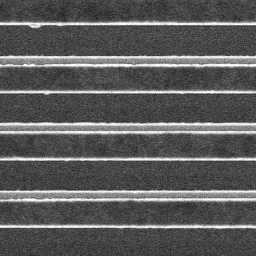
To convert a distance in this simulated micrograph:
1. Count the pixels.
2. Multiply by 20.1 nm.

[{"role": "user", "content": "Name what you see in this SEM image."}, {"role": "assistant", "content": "lines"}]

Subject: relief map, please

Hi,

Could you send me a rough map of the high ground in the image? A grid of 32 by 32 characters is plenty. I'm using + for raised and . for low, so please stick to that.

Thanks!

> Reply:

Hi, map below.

++++++++++++++++++++++++++++++++
++++++++++++++++++++++++++++++++
++++++++++++++++++++++++++++++++
................................
................................
................................
................................
++++++++++++++++++++++++++++++++
++++++++++++++++++++++++++++++++
++++++++++++++++++++++++++++++++
++++++++++++++++++++++++++++++++
+.+..++++.+++.+.++++++++++++++++
................................
................................
................................
................................
++++++++++++++++++++++++++++++++
++++++++++++++++++++++++++++++++
++++++++++++++++++++++++++++++++
++++++++++++++++++++++++++++++++
................................
................................
................................
................................
++++++++++++++++++++++++++++++++
++++++++++++++++++++++++++++++++
++++++++++++++++++++++++++++++++
++++++++++++++++++++++++++++++++
................................
................................
................................
................................